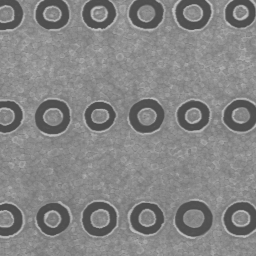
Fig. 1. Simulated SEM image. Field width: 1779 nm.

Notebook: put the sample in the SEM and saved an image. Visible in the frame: a regular array of ring-shaped grooves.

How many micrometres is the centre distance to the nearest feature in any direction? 0.325